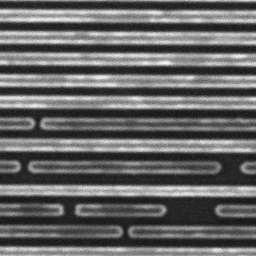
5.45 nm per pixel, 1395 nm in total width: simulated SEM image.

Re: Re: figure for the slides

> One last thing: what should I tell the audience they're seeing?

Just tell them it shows parallel lines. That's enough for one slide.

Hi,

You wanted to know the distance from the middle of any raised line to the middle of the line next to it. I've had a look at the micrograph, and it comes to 118 nm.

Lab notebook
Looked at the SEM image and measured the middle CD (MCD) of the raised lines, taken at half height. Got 57.3 nanometers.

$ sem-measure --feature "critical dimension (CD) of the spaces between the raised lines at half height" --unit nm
57.9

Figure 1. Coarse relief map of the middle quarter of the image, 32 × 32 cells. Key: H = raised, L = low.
LLLLLLLLLLLLLLLLLLLLLLLLLLLLLLLL
LLLLLLLLLLLLLLLLLLLLLLLLLLLLLLLL
LLLLLLLLLLLLLLLLLLLLLLLLLLLLLLLL
HHHHHHHHHHHHHHHHHHHHHHHHHHHHHHHH
HHHHHHHHHHHHHHHHHHHHHHHHHHHHHHHH
LLLLLLLLLLLLLLLLLLLLLLLLLLLLLLLL
LLLLLLLLLLLLLLLLLLLLLLLLLLLLLLLL
LLLLLLLLLLLLLLLLLLLLLLLLLLLLLLLL
HHHHHHHHHHHHHHHLLLLLLLLLLLLLLLLL
HHHHHHHHHHHHHHHHHHHHHHHHHHHHHHHH
HHHHHHHHHHHHHHHHHHHHHHHHHHHHHHHH
LLLLLLLLLLLLLLLLLLLLLLLLLLLLLLLL
LLLLLLLLLLLLLLLLLLLLLLLLLLLLLLLL
LLLLLLLLLLLLLLLLLLLLLLLLLLLLLLLL
HHHHHHHHHHHHHHHHHHHHHHHHHHHHHHHH
HHHHHHHHHHHHHHHHHHHHHHHHHHHHHHHH
LLLLLLLLLLLLLLLLLLLLLLLLLLLLLLLL
LLLLLLLLLLLLLLLLLLLLLLLLLLLLLLLL
LLLLLLLLLLLLLLLLLLLLLLLLLLLLLLLL
HHHHHHHHHHHHHHHHHHHHHHHHHHHHHHHH
HHHHHHHHHHHHHHHHHHHHHHHHHHHHHHHH
HHLLLLHHHHHHHHHHHHHHHHHHHHHHHHHH
LLLLLLLLLLLLLLLLLLLLLLLLLLLLLLLL
LLLLLLLLLLLLLLLLLLLLLLLLLLLLLLLL
LLLLLLLLLLLLLLLLLLLLLLLLLLLLLLLL
HHHHHHHHHHHHHHHHHHHHHHHHHHHHHHHH
HHHHHHHHHHHHHHHHHHHHHHHHHHHHHHHH
LLLLLLLLLLLLLLLLLLLLLLLLLLLLLLLL
LLLLLLLLLLLLLLLLLLLLLLLLLLLLLLLL
LLLLLLLLLLLLLLLLLLLLLLLLLLLLLLLL
LLLLLLLLLLLLLLLLLLLLLLLLLLLLLLLL
HHHHHHHHHHHHHHHHHHHHHHHHHHHHHHHH